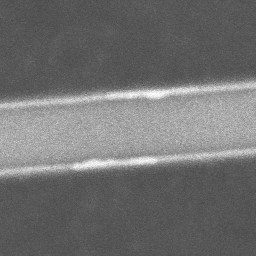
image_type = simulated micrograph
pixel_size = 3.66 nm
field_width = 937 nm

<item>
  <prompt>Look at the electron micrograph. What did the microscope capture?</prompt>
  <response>one or a few lines or trenches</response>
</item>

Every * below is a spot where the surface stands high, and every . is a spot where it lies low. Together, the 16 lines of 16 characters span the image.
****************
****************
****************
****************
****************
***************.
**..............
................
................
..............**
..**************
****************
****************
****************
****************
****************